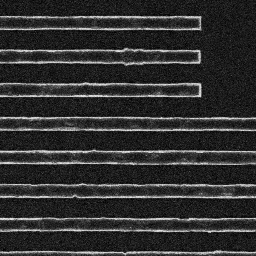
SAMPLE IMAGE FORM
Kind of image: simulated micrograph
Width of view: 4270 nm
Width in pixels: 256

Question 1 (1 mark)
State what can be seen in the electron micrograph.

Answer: parallel lines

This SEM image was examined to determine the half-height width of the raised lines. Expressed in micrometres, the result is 0.213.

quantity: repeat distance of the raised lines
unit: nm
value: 562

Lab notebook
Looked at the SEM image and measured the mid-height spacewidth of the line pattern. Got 0.348 micrometres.